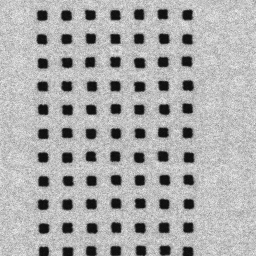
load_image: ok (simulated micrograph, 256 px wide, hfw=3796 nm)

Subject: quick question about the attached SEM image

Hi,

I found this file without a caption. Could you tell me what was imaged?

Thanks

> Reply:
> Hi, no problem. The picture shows a regular array of holes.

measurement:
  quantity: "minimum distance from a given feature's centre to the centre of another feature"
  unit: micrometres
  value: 0.345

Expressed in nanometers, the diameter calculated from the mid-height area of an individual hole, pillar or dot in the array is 166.